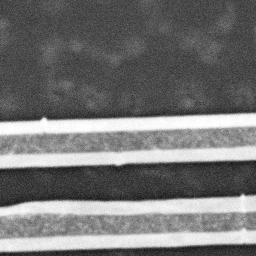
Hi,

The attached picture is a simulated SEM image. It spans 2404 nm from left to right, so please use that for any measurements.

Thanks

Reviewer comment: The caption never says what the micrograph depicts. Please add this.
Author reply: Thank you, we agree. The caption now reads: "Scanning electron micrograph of one or a few lines or trenches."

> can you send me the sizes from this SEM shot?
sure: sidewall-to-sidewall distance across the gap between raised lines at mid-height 480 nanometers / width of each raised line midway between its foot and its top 302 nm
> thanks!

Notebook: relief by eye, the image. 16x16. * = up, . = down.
................
................
................
................
................
................
................
................
****************
****************
................
................
................
****************
****************
................